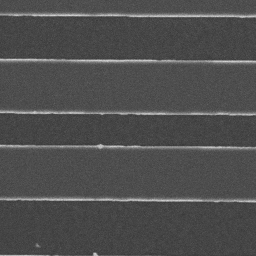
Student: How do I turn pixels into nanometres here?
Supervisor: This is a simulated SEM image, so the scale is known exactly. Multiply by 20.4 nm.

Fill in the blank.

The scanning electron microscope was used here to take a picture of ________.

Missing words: lines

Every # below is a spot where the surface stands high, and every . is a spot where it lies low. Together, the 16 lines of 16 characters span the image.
################
................
................
................
################
################
################
................
................
################
################
################
..........######
................
................
................